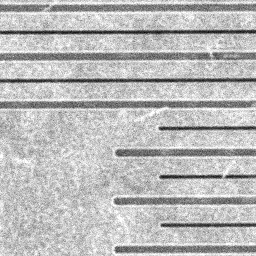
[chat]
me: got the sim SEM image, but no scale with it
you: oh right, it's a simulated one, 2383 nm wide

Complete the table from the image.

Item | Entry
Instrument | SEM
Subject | parallel lines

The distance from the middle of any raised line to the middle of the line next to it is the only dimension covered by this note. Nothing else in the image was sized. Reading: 220 nanometers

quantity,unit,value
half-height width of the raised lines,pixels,17.5